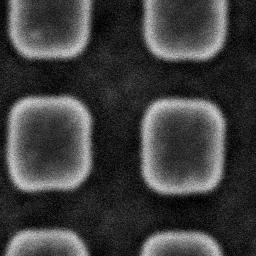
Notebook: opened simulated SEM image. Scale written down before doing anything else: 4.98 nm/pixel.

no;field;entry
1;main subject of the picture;raised bodies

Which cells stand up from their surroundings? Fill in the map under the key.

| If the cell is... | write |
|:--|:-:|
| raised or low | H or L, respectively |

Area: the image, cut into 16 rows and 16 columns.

LHHHHHLLLHHHHHLL
LHHHHLLLLHHHHHLL
LHHHHLLLLHHHHHLL
LLHHLLLLLLHHHLLL
LLLLLLLLLLLLLLLL
LLLLLLLLLLLLLLLL
LHHHHLLLLLHHHLLL
LHHHHHLLLHHHHHLL
LHHHHHLLLHHHHHLL
LHHHHHLLLHHHHHLL
LHHHHHLLLHHHHHLL
LHHHHLLLLHHHHLLL
LLLLLLLLLLLLLLLL
LLLLLLLLLLLLLLLL
LLHLLLLLLLLLLLLL
LHHHHLLLLHHHHHLL